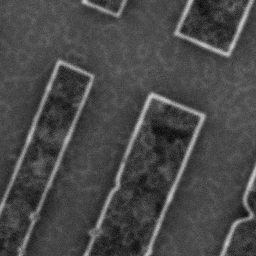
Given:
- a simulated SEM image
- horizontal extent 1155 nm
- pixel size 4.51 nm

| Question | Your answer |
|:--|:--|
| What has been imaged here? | one or a few lines or trenches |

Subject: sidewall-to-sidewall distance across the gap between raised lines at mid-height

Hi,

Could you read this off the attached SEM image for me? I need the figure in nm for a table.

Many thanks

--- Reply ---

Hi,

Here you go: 279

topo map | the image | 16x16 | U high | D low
DDDDDDUUDDDDUUUD
DDDDDDDDDDDUUUUD
DDDDDDDDDDDDUUUD
DDDDDDDDDDDDDDDD
DDDUUDDDDDDDDDDD
DDDUUUDDDDDDDDDD
DDDUUDDDDUUDDDDD
DDUUUDDDDUUUUDDD
DDUUDDDDUUUUDDDD
DUUUDDDDUUUUDDDD
DUUDDDDDUUUDDDDD
DUUDDDDUUUUDDDDD
UUUDDDDUUUUDDDDU
UUDDDDUUUUDDDDDU
UUDDDDUUUUDDDDUU
UUDDDDUUUDDDDDUU